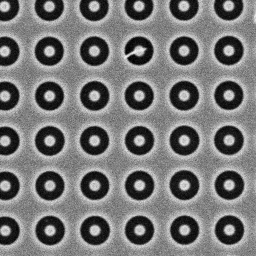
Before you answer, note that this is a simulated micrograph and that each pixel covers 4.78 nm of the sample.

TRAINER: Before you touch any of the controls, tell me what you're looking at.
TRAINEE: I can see an array of small figures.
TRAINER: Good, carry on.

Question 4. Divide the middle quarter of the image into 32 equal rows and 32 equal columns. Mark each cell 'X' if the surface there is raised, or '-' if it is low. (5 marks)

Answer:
XXXXXXX-XXXXXXXXXX-XXXXXXXXXXXXX
XXXXXXXXXXXXXXXXXXXXXXXXXXXXXXXX
XXXXXXXXXXXXXXXXXXXXXXXXXXXXXXXX
XXXXXXXXXXXXXXXXXXXXXXXXXXXXXXXX
XXXXXX---XXXXXXXX---XXXXXXXX----
XXXXX-----XXXXXX-----XXXXXX-----
XXXX-------XXXX-------XXXXX-----
XXXX---XX--XXXX---XX---XXX---XX-
XXXX---XX--XXXX---XX--XXXX---XX-
XXXX-------XXXX-------XXXXX-----
XXXXX-----XXXXXX-----XXXXXX-----
XXXXXXX--XXXXXXXXX--XXXXXXXXX--X
XXXXXXXXXXXXXXXXXXXXXXXXXXXXXXXX
XXXXXXXXXXXXXXXXXXXXXXXXXXXXXXXX
XXXXXXXXXXXXXXXXXXXXXXXXXXXXXXXX
XXXXXXX-XXXXXXXXXXXXXXXXXXXXX--X
XXXXX-----XXXXXX-----XXXXXX-----
XXXX-------XXXX-------XXXXX-----
XXXX---XX--XXXX---XX--XXXX---XX-
XXXX--XXX--XXXX---XX---XXX---XX-
XXXX-------XXXX-------XXXXX-----
XXXXX------XXXXX------XXXXX-----
XXXXXX---XXXXXXXXX--XXXXXXXX----
XXXXXXXXXXXXXXXXXXXXXXXXXXXXXXXX
XXXXXXXXXXXXXXXXXXXXXXXXXXXXXXXX
XXXXXXXXXXXXXXXXXXXXXXXXXXXXXXXX
XXXXXXXXXXXXXXXXXXXXXXXXXXXXXXXX
XXXXXX----XXXXXXX----XXXXXXX----
XXXXX------XXXXX------XXXXX-----
XXXX---X---XXXX---XX--XXXX---XX-
XXXX---XX--XXXX---XX---XXX---XX-
XXXX---X---XXXX-------XXXXX-----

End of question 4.